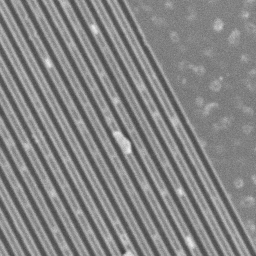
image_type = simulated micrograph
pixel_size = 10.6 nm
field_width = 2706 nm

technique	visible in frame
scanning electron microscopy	parallel lines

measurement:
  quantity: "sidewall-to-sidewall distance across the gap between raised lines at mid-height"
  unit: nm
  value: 71.3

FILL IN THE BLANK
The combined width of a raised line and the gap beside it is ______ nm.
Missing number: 151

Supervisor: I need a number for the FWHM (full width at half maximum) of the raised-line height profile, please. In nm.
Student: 79.5